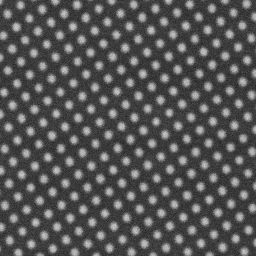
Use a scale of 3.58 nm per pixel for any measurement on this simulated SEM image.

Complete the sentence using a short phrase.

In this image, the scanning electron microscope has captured a regular array of raised bodies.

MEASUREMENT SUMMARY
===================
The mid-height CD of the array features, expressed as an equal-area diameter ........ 28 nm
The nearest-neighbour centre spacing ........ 55.5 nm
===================